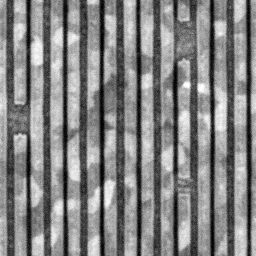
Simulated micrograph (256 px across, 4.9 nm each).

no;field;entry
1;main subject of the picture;parallel lines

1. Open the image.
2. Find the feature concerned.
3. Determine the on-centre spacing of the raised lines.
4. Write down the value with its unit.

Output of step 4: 0.0901 microns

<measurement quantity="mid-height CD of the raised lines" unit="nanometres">50.2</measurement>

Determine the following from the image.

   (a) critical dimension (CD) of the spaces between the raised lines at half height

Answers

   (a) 41.7 nm